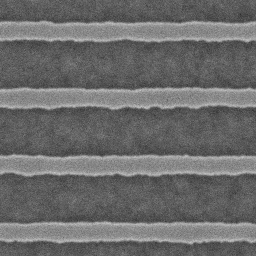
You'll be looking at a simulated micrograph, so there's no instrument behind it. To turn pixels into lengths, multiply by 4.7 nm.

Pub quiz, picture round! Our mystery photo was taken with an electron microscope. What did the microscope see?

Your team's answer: lines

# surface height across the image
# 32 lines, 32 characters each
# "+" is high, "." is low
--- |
................................
................................
................................
++++++++++++++++++++++++++++++++
++++++++++++++++++++++++++++++++
................................
................................
................................
................................
................................
................................
++++++++++++++++++++++++++++++++
++++++++++++++++++++++++++++++++
......+.......+.................
................................
................................
................................
................................
................................
.++.............................
++++++++++++++++++++++++++++++++
++++++++++++++++++++++++++++++++
................................
................................
................................
................................
................................
................................
++++++++++++++++++++++++++++++++
++++++++++++++++++++++++++++++++
................................
................................